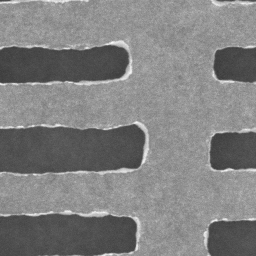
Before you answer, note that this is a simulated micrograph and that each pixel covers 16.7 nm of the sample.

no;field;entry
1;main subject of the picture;holes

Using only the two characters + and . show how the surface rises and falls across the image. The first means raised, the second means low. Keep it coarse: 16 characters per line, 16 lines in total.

++++++++++++++++
++++++++++++++++
++++++++++++++++
........+++++...
........+++++...
++++++++++++++++
++++++++++++++++
++++++++++++++++
.........++++...
.........++++...
........+++++...
++++++++++++++++
++++++++++++++++
.....+.+++++++++
.........++++...
........+++++...